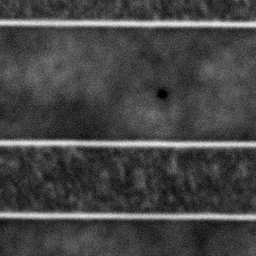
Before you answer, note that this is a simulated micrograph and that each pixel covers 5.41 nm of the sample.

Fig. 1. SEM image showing wiring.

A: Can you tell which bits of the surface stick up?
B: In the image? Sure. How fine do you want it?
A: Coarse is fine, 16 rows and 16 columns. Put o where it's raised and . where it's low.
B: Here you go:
oooooooooooooooo
............oooo
................
................
................
................
................
................
................
oooooooooooooooo
oooooooooooooooo
oooooooooooooooo
oooooooooooooooo
........oooooooo
................
................